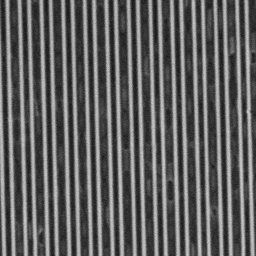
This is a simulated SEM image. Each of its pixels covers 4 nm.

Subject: parallel lines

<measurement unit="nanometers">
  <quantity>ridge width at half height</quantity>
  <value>11.5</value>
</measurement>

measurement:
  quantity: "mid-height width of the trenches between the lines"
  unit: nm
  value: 26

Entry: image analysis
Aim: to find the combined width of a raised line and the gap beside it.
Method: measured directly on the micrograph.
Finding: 43.3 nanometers